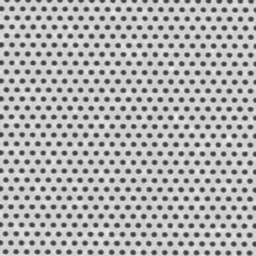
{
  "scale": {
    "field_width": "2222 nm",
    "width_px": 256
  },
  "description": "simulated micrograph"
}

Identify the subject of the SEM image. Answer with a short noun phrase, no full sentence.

a regular array of holes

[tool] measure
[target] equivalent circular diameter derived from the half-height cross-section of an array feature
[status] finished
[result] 5.53 px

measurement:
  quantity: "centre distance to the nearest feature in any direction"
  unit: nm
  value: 88.4